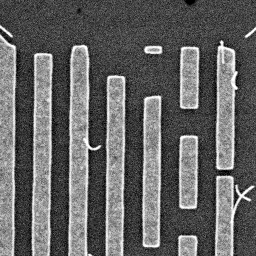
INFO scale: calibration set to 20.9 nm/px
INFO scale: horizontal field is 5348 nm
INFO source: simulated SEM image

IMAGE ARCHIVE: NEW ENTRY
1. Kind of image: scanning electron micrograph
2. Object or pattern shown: wiring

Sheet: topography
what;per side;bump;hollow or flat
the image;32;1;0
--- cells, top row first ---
00000000000000000000000000000000
00000000000000000000000000000000
00000000000000000000000000000000
00000000000000000000000000000000
00000000000000000000000000000000
10000000000000000000000000000000
11000000011000000011000110011000
11001100011000000000000110011000
11001100011000000000000110011000
11001100011000000000000110011000
11001100011001100000000110011000
11001100011001100000000110011000
11001100011001100011000110011000
11001100011001100011000000011000
11001100011001100011000000011000
11001100011001100011000000011000
11001100011001100011000000011000
11001100011001100011000110011000
11001100011001100011000110011000
11001100011001100011000110011000
11001100011001100011000110011000
11001100011001100011000110000000
11001100011001100011000110011000
11001100011001100011000110011000
11001100011001100011000110011000
11001100011001100011000100011000
11001100011001100011000000011000
11001100011001100011000000011000
11001100011001100011000000011000
11001100011001100011000000011000
11001100011001100011001110011000
11001100011001100000001100011000